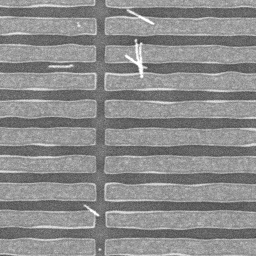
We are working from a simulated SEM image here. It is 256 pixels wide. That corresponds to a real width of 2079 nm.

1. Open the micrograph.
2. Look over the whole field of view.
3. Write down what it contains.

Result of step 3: groups of lines, slits or small figures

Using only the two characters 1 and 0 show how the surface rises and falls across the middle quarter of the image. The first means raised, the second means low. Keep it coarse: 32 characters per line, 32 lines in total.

00000000000000000001000000000000
00000000000000000001000000000000
11111111000100000111111100011111
11111111001111111111111111111111
11111111001111111111111111111111
11111111001111111111111111111111
00000000000110000000000000000000
00000000000000000000000000000000
00000000000000000000000000000000
11111111001111111111111000000111
11111111001111111111111111111111
11111111001111111111111111111111
11111111001111111111111111111111
00000000000000000000000000000000
00000000000000000000000000000000
00000000000000000000000000000000
11111111000111111111111111111111
11111111001111111111111111111111
11111111001111111111111111111111
11111111001111111111111111111111
00000000000000000000000000000000
00000000000000000000000000000000
00000000000000000000000000000000
11111111000111111111111111111111
11111111001111111111111111111111
11111111001111111111111111111111
11111111001111111111111111111111
00000000000000000000000000000000
00000000000000000000000000000000
00000000000000000000000000000000
11111111001111111111111111111110
11111111001111111111111111111111